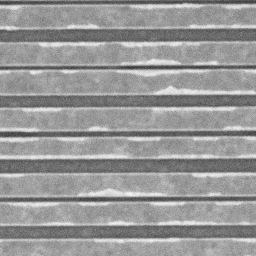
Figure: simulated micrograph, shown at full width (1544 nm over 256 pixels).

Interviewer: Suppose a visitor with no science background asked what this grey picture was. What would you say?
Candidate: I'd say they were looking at parallel lines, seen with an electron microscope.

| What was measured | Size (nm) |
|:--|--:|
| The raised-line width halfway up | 135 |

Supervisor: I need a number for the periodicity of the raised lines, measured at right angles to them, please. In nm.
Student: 198